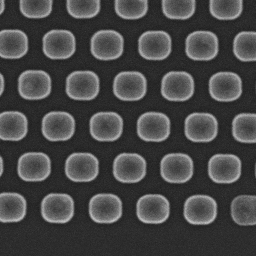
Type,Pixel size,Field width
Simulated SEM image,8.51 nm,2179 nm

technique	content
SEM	a regular array of raised bodies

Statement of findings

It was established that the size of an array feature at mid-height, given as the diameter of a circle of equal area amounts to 262 nanometres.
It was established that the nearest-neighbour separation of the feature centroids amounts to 400 nm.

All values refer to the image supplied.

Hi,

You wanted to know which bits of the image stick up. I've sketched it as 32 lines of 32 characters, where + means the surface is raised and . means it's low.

...+++..++++..++++..++++..++++..
...+++...+++...+++...+++...+++..
................................
................................
+++...+++...+++...+++...+++...++
+++...+++...+++...+++..++++..+++
+++...+++...+++...+++..++++..+++
..............................+.
................................
...+++...+++...+++...+++...+++..
..++++..++++..++++..++++..++++..
...+++..++++..++++..++++..++++..
...........................++...
................................
+++...+++...+++...+++...++....++
+++..++++..++++..++++..++++..+++
+++..++++..++++..++++..++++..+++
......+...........++....++....++
................................
...+++...+++...++....++....++...
..++++..++++..++++..++++..++++..
..++++..++++..++++..++++..++++..
...++....++....++....++....++...
................................
++....++....++....+.............
+++..++++..++++..++++..++++....+
+++..++++..++++..++++..++++.....
++....++....++....+++...+++.....
................................
................................
................................
................................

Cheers